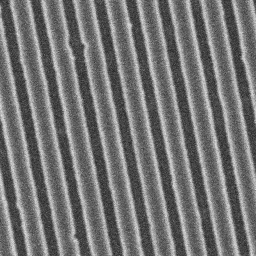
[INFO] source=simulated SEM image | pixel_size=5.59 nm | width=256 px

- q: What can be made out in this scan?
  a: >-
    parallel lines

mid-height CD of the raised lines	106	nanometers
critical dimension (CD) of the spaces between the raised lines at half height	72.7	nanometres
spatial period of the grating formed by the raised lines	174	nm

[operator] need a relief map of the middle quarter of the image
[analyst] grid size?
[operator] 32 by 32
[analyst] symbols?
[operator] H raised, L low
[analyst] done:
HHHLLLHHHHLLLLHHHHLLLLHHHHLLLHHH
HHHLLLHHHHLLLLHHHHHLLLHHHHLLLLHH
HHHLLLHHHHHLLLHHHHHLLLHHHHHLLLHH
HHHLLLHHHHHLLLHHHHHLLLHHHHHLLLHH
HHHLLLLHHHHLLLHHHHHLLLLHHHHLLLHH
HHHHLLLHHHHLLLLHHHHLLLLHHHHLLLLH
HHHLLLLHHHHLLLLHHHHLLLLHHHHLLLLH
HHHHLLLHHHHHLLLHHHHHLLLHHHHHLLLH
HHHHLLLLHHHHLLLHHHHHLLLHHHHHLLLH
HHHHLLLLHHHHLLLHHHHHLLLLHHHHLLLH
HHHHLLLLHHHHLLLLHHHHLLLLHHHHLLLL
HHHHHLLLHHHHHLLLHHHHHLLLHHHHLLLL
HHHHHLLLHHHHHLLLHHHHHLLLHHHHHLLL
HHHHHLLLHHHHHLLLHHHHHLLLHHHHHLLL
LHHHHLLLHHHHHLLLHHHHHLLLHHHHHLLL
LHHHHLLLLHHHHLLLLHHHHLLLLHHHHLLL
LHHHHHLLLHHHHHLLLHHHHLLLLHHHHLLL
LHHHHHLLLHHHHHLLLHHHHHLLLHHHHHLL
LHHHHHLLLHHHHHLLLHHHHHLLLHHHHHLL
LLHHHHLLLLHHHHLLLLHHHHLLLLHHHHLL
LLHHHHLLLLHHHHLLLLHHHHLLLLHHHHLL
LLHHHHHLLLHHHHLLLLHHHHLLLLHHHHLL
LLHHHHHLLLHHHHHLLLHHHHHLLLHHHHHL
LLHHHHHLLLHHHHHLLLHHHHHLLLHHHHHL
LLLHHHHLLLLHHHHLLLHHHHHLLLHHHHHL
LLLHHHHLLLLHHHHLLLLHHHHLLLLHHHHL
LLLHHHHHLLLHHHHHLLLHHHHLLLLHHHHL
LLLHHHHHLLLHHHHHLLLHHHHHLLLHHHHH
LLLHHHHHLLLHHHHHLLLHHHHHLLLHHHHH
LLLLHHHHLLLHHHHHLLLHHHHHLLLHHHHH
LLLLHHHHLLLHHHHHLLLLHHHHLLLHHHHH
HLLLHHHHHLLLHHHHLLLLHHHHLLLLHHHH